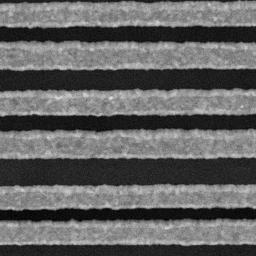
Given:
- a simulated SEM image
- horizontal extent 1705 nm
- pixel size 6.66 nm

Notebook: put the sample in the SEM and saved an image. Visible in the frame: lines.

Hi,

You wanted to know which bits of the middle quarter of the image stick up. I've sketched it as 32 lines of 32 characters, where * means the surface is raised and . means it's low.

********************************
................................
................................
................................
................................
................................
................................
********************************
********************************
********************************
********************************
********************************
********************************
................................
................................
................................
................................
********************************
********************************
********************************
********************************
********************************
********************************
.**.......*..*.**.....**.....**.
................................
................................
................................
................................
................................
................................
................................
********************************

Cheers